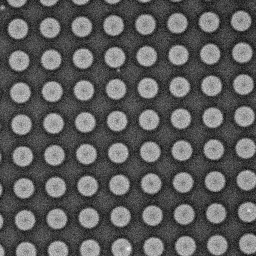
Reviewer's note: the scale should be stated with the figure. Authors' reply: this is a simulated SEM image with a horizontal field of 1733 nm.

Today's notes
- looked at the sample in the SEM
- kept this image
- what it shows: an array of small figures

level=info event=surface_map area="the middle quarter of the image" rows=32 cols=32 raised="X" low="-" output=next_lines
---XXX------XX------------------
--------------------------------
--------------------------------
----------------------------XX--
----XX-----XXXX----XXXX----XXXX-
---XXXX----XXXX----XXXX----XXXX-
---XXXX----XXXX----XXXX----XXXX-
---XXXX----XXXX----XXXX----XXXX-
---XXX------XX------------------
--------------------------------
--------------------------------
----------------------------XX--
----XX------XXX----XXXX----XXXX-
---XXXX----XXXXX---XXXXX---XXXXX
---XXXXX---XXXXX---XXXXX---XXXX-
---XXXX----XXXX----XXXX-----XXX-
----XXX-----XX------------------
--------------------------------
--------------------------------
-----------------------------X--
----XXX-----XXX-----XXX----XXXXX
---XXXXX---XXXXX---XXXXX---XXXXX
---XXXXX---XXXXX---XXXXX---XXXXX
---XXXXX----XXXX----XXX-----XXX-
----XXX------X------------------
--------------------------------
--------------------------------
-----------------------------XX-
-----XX-----XXX-----XXXX----XXXX
----XXXX----XXXX----XXXX----XXXX
----XXXX----XXXX----XXXX----XXXX
----XXXX----XXXX----XXXX----XXX-